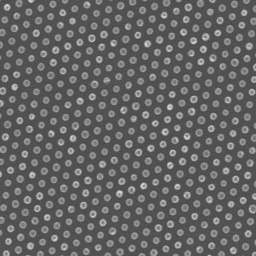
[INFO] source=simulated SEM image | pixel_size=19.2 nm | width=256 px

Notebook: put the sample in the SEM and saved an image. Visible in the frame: a regular array of raised bodies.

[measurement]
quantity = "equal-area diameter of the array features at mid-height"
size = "0.125 um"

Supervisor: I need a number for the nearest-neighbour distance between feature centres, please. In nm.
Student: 240